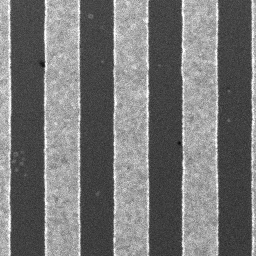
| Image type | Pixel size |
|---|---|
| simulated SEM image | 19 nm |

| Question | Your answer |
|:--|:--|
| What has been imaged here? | one or a few lines or trenches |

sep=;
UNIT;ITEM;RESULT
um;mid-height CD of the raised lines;0.65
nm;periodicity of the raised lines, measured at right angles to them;1310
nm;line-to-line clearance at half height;662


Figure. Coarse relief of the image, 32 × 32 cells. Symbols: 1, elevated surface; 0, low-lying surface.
10000011110000111100000111100000
10000011110000111100000111100000
10000011110000111100000111100000
10000011110000111100000111100000
10000011110000111100000111100000
10000011110000111100000111100000
10000011110000111100000111100000
10000011110000111100000111100000
10000011110000111110000111100000
10000011110000111100000111100000
10000011110000111100000111100000
10000011110000111100000111100000
10000011110000111100000111100000
10000011110000111100000111100000
10000011110000111100000111100000
10000011110000111100000111100000
10000011110000111100000111100000
10000011110000111100000111100000
10000011110000111100000111100000
10000011110000111100000111100000
10000011110000111100000111100000
10000011110000111100000111100000
10000011110000111110000111100000
10000011110000111110000111100000
10000011110000111110000111100000
10000011110000111110000111100000
10000011110000111110000111100000
10000011110000111100000111100000
10000011110000111100000111100000
10000011110000111100000111100000
10000011110000111110000111100000
10000011110000111110000111100000